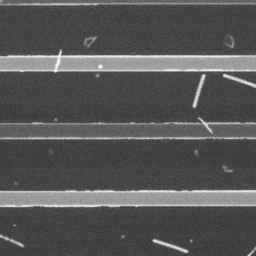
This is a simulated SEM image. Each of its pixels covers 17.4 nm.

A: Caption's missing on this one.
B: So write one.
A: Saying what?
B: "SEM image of lines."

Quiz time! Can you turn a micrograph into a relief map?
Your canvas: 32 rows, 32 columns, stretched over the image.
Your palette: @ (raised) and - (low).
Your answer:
@@@@@@@@@@@---------------------
--------------------------------
--------------------------------
--------------------------------
--------------------------------
--------------------------------
--------------------------------
@@@@@@@@@@@@@@@@@@@@@@@@@@@@@@@@
@@@@@@@@@@@@@@@@@@@@@@@@@@@@@@@@
--------------------------------
--------------------------------
--------------------------------
--------------------------------
--------------------------------
--------------------------------
@@@@@@@@@@@@@@@@@@@@@@@@@@@@@@@@
@@@@@@@@@@@@@@@@@@@@@@@@@@@@@@@@
--------------------------------
--------------------------------
--------------------------------
--------------------------------
--------------------------------
--------------------------------
--------------------------------
@@@@@@@@@@@@@@@@@@@@@@@@@@@@@@@@
@@@@@@@@@@@@@@@@@@@@@@@@@@@@@@@@
--------------------------------
--------------------------------
--------------------------------
--------------------------------
--------------------------------
--------------------------------